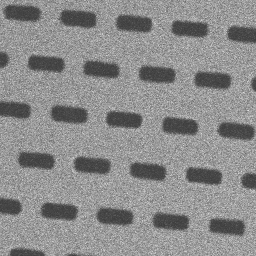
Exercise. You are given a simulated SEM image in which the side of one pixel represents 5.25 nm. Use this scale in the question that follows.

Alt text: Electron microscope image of a regular array of holes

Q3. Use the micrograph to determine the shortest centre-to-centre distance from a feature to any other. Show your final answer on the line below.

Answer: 0.292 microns